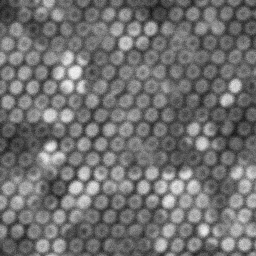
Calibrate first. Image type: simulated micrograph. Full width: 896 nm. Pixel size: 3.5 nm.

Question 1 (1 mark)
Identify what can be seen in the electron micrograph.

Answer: a regular array of raised bodies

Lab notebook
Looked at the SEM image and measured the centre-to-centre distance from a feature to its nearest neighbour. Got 57.3 nm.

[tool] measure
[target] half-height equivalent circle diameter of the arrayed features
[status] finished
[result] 40.3 nm